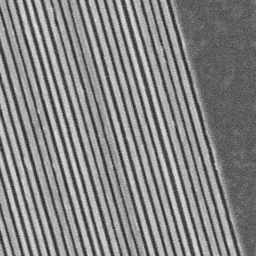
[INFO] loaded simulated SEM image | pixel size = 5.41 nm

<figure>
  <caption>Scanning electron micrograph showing parallel lines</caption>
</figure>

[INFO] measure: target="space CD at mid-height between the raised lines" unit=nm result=18.8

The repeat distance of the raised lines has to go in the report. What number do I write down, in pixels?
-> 8.65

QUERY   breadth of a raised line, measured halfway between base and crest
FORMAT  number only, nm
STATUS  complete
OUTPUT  28